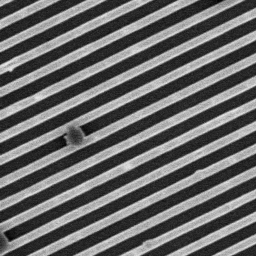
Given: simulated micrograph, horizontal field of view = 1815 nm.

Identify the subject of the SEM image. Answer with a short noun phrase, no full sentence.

parallel lines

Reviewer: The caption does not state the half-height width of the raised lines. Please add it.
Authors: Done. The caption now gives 54.2 nanometers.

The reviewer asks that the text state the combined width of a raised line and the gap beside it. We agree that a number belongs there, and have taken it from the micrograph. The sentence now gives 0.144 µm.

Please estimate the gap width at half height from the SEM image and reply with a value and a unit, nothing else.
89.1 nm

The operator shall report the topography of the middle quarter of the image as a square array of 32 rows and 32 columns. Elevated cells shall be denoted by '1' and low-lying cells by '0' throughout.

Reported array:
00000001111000000001111000000011
00000111100000000111100000001111
00011110000000011110000000111100
01111000000001111000000011110000
11100000001111100000001111000000
10000000111100000000111100000000
00000011110000000011110000000111
00001111000000001111000000011111
00111100000000111100000000111100
11110000000011110000000111110000
11000000001111000000011111000000
00000000111100000001111100000011
00000011110000000111110000001111
00001111000000011111000000111110
00111100000001111000000011111000
11110000000111100000001111100000
11110000011110000000011110000000
11111001111000000001111000000011
11111111100000000111100000001111
01111110000000011110000000111100
11111000000001111000000011110000
11100000000111100000001111000000
10000000111110000000111100000001
00000001111000000011110000000111
00001111100000001111000000011110
00111100000000111100000001111100
11110000000011110000000111110000
11000000001111000000011111000000
00000000111100000001111100000001
00000011110000000111110000000111
00001111000000011111000000011110
00111100000001111000000001111000